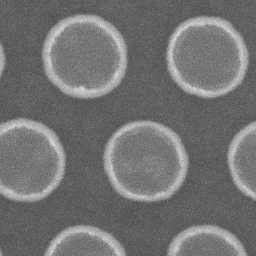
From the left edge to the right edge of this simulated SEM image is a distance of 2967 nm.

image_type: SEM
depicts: raised bodies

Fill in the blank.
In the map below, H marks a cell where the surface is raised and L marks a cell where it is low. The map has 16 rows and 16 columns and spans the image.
LLLLLLLLLLLLLLLL
LLLLHHHLLLLLHHLL
LLLHHHHLLLLHHHHL
LLLHHHHHLLLHHHHL
LLLHHHHHLLLHHHHL
LLLLHHHLLLLLHHLL
LLLLLLLLLLLLLLLL
LLLLLLLLLLLLLLLL
HHHLLLLHHHHLLLLH
HHHHLLLHHHHLLLHH
HHHHLLLHHHHHLLHH
HHHLLLLHHHHLLLLH
LLLLLLLLLLLLLLLL
LLLLLLLLLLLLLLLL
LLLLHHLLLLLLHHLL
LLLHHHHLLLLHHHHL